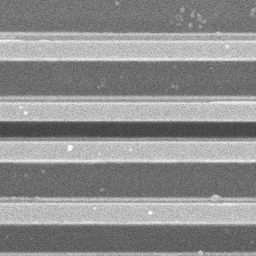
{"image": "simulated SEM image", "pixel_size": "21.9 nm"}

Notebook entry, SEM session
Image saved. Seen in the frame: lines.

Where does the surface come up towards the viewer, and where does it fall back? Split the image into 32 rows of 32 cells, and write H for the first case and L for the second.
LLLLLLLLLLLLLLLLLLLLLLLLLLLLLLLL
LLLLLLLLLLLLLLLLLLLLLLLLLLLLLLLL
LLLLLLLLLLLLLLLLLLLLLLLLLLLLLLLL
LLLLLLLLLLLLLLLLLLLLLLLLLLLLLLLL
HHHHHHHHHHHHHHHHHHHHHHHHHHHHHHHH
HHHHHHHHHHHHHHHHHHHHHHHHHHHHHHHH
HHHHHHHHHHHHHHHHHHHHHHHHHHHHHHHH
LLLLLLLLLLLLLLLLLLLLLLLLLLLLLLLL
LLLLLLLLLLLLLLLLLLLLLLLLLLLLLLLL
LLLLLLLLLLLLLLLLLLLLLLLLLLLLLLLL
LLLLLLLLLLLLLLLLLLLLLLLLLLLLLLLL
LLLLLLLLLLLLLLLLLLLLLLLLLLLLLLLL
HHHHHHHHHHHHHHHHHHHHHHHHHHHHHHHH
HHHHHHHHHHHHHHHHHHHHHHHHHHHHHHHH
HHHHHHHHHHHHHHHHHHHHHHHHHHHHHHHH
LLLLLLLLLLLLLLLLLLLLLLLLLLLLLLLL
LLLLLLLLLLLLLLLLLLLLLLLLLLLLLLLL
HHHHHHHHHHHHHHHHHHHHHHHHHHHHHHHH
HHHHHHHHHHHHHHHHHHHHHHHHHHHHHHHH
HHHHHHHHHHHHHHHHHHHHHHHHHHHHHHHH
LLLLLLLLLLLLLLLLLLLLLLLLLLLLLLLL
LLLLLLLLLLLLLLLLLLLLLLLLLLLLLLLL
LLLLLLLLLLLLLLLLLLLLLLLLLLLLLLLL
LLLLLLLLLLLLLLLLLLLLLLLLLLLLLLLL
LLLLLLLLLLLLLLLLLLLLLLLLLLLLLLLL
HHHHHHHHHHHHHHHHHHHHHHHHHHHHHHHH
HHHHHHHHHHHHHHHHHHHHHHHHHHHHHHHH
HHHHHHHHHHHHHHHHHHHHHHHHHHHHHHHH
LLLLLLLLLLLLLLLLLLLLLLLLLLLLLLLL
LLLLLLLLLLLLLLLLLLLLLLLLLLLLLLLL
LLLLLLLLLLLLLLLLLLLLLLLLLLLLLLLL
LLLLLLLLLLLLLLLLLLLLLLLLLLLLLLLL